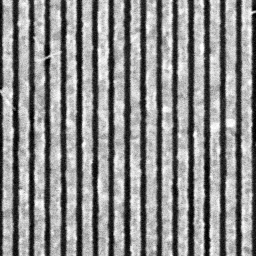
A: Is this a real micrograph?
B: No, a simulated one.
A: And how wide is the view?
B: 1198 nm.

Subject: parallel lines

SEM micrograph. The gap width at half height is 34.5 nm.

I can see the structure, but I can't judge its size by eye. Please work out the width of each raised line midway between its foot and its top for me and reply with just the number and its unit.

43.3 nanometers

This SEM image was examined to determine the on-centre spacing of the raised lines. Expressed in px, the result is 15.9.